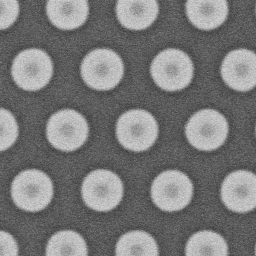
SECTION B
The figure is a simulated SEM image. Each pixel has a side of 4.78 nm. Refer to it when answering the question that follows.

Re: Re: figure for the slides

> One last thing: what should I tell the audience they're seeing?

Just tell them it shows an array of small figures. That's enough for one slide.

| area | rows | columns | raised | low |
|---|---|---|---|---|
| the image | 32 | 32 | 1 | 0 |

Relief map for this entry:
11000011111000011111000111110000
11000011111000011111000111110000
11000011111000011110000011110000
10000001100000001100000001100000
00000000000000000000000000000000
00000000000000000000000000000000
00011000000111000000111000000110
00111100001111100001111100001111
01111100001111100001111100001111
00111100001111100001111100001111
00111100000111100000111000001111
00000000000000000000000000000000
00000000000000000000000000000000
00000000000000000000000000000000
11000001110000011110000011110000
11000011111000011111000111110000
11000011111000011111000111110000
11000011111000011110000011110000
10000001110000001100000001100000
00000000000000000000000000000000
00000000000000000000000000000000
00011000000011000000110000000110
00111100000111100001111100001111
01111100001111100001111100001111
00111100001111100001111100001111
00111100000111100001111000001111
00000000000000000000000000000000
00000000000000000000000000000000
00000000000000000000000000000000
10000001110000011110000011100000
11000011111000011110000111110000
11000011111000111111000111110000